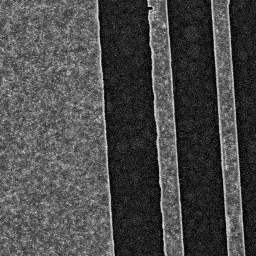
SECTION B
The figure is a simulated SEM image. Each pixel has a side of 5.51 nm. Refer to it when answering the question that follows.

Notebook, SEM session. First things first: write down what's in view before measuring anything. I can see one or a few lines or trenches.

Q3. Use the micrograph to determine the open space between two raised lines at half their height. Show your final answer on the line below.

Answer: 263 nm